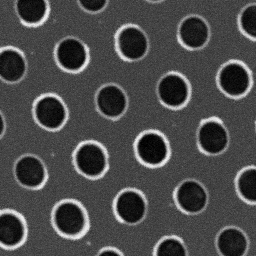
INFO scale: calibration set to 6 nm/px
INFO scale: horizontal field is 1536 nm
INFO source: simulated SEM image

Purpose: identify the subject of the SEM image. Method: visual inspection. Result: a regular array of holes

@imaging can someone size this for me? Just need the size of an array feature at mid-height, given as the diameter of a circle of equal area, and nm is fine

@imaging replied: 183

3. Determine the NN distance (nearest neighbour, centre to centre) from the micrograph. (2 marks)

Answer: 371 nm